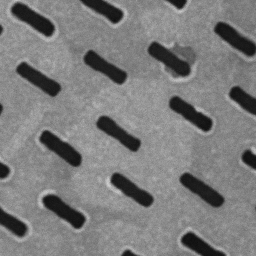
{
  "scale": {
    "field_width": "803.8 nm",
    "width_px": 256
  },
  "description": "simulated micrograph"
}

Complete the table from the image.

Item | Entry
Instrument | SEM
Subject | a regular array of holes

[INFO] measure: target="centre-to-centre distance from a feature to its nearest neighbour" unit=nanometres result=189